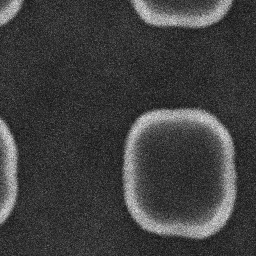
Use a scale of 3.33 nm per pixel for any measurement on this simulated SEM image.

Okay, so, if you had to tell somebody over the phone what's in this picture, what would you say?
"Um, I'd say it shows raised bodies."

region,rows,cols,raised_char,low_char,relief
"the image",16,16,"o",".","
o........ooooo..
................
................
................
................
................
................
.........oooo...
........oooooo..
o.......oooooo..
o.......oooooo..
o.......oooooo..
o.......oooooo..
.........ooooo..
................
................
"